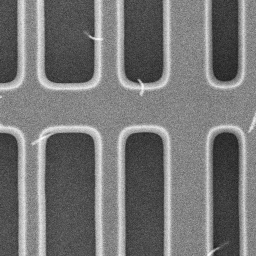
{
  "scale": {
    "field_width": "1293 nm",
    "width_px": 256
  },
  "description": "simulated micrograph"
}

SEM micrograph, groups of lines, slits or small figures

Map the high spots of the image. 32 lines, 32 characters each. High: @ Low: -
---@@-------@@@------@@@@@----@@
---@@-------@@@------@@@@@----@@
---@@-------@@@------@@@@@----@@
---@@-------@@@------@@@@@----@@
---@@-------@@@------@@@@@----@@
---@@-------@@@------@@@@@----@@
---@@-------@@@------@@@@@----@@
---@@-------@@@------@@@@@----@@
---@@-------@@@------@@@@@----@@
--@@@-------@@@------@@@@@----@@
--@@@@-----@@@@@----@@@@@@@@-@@@
@@@@@@@@@@@@@@@@@@@@@@@@@@@@@@@@
@@@@@@@@@@@@@@@@@@@@@@@@@@@@@@@@
@@@@@@@@@@@@@@@@@@@@@@@@@@@@@@@@
@@@@@@@@@@@@@@@@@@@@@@@@@@@@@@@@
@@@@@@@@@@@@@@@@@@@@@@@@@@@@@@@@
--@@@@-----@@@@@----@@@@@@@--@@@
---@@@------@@@------@@@@@----@@
---@@-------@@@------@@@@@----@@
---@@-------@@@------@@@@@----@@
---@@-------@@@------@@@@@----@@
---@@-------@@@------@@@@@----@@
---@@-------@@@------@@@@@----@@
---@@-------@@@------@@@@@----@@
---@@-------@@@------@@@@@----@@
---@@-------@@@------@@@@@----@@
---@@-------@@@------@@@@@----@@
---@@-------@@@------@@@@@----@@
---@@-------@@@------@@@@@----@@
---@@-------@@@------@@@@@----@@
---@@-------@@@------@@@@@----@@
---@@-------@@@------@@@@@----@@